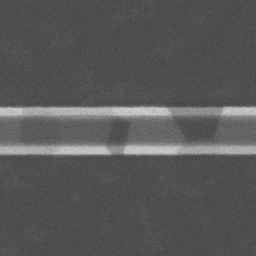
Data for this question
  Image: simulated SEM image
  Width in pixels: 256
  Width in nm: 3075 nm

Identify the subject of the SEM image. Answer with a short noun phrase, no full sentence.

one or a few lines or trenches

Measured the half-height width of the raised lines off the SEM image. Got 475 nm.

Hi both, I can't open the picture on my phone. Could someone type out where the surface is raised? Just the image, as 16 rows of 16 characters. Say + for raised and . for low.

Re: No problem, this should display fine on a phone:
................
................
................
................
................
................
................
++++++++++++++++
++++++++++++++++
................
................
................
................
................
................
................